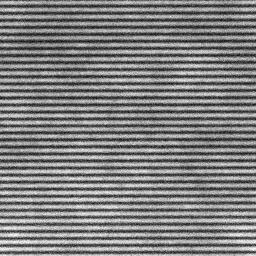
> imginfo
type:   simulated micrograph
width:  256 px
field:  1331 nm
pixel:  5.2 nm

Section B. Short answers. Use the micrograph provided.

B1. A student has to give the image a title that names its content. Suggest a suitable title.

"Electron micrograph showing parallel lines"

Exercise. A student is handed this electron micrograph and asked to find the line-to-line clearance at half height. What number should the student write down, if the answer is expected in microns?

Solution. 0.0182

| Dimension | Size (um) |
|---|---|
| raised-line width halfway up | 0.0182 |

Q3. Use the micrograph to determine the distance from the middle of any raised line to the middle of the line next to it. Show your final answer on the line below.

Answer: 7.02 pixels